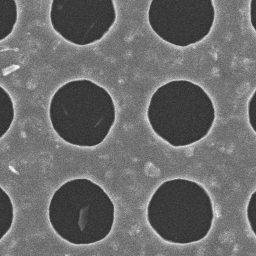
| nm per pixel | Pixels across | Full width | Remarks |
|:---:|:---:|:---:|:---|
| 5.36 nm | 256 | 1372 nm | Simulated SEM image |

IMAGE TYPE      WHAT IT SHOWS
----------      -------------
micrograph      holes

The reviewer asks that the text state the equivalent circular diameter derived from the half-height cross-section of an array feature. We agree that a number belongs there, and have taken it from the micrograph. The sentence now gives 351 nanometres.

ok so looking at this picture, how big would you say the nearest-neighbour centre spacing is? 530 nm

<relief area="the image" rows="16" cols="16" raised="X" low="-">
-XX----XX----XXX
-XX----XX----XXX
XXXX--XXXX---XXX
XXXXXXXXXXXXXXXX
XXXXXXXXXXXXXXXX
XXXX--XXXX---XXX
-XX----XX----XXX
-XX----XX----XXX
XXXX---XXX---XXX
XXXXXXXXXXXXXXXX
XXXXXXXXXXXXXXXX
XXXX--XXXX--XXXX
-XX----XX----XXX
-XX----XX----XX-
XXXX---XXX---XXX
XXXXXXXXXXXXXXXX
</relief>